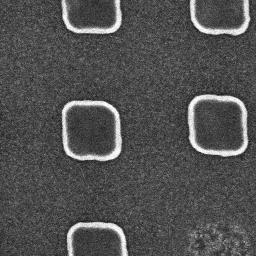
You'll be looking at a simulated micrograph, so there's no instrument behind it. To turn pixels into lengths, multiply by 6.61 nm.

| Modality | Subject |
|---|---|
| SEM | raised bodies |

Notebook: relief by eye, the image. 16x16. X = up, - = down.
----XXX-----XXX-
----XXX-----XXX-
----------------
----------------
----------------
----------------
-----XX-----XXX-
----XXX-----XXX-
----XXX-----XXX-
----XXX------XX-
----------------
----------------
----------------
----------------
----XXX---------
----XXXX--------